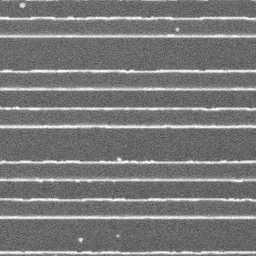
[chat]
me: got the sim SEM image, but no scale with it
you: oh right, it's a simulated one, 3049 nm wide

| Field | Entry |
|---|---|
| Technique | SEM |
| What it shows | lines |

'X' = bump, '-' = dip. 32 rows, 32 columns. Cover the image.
--------------------------------
--------------------------------
XXXXXXXXXXXXXXXXXXXXXXXXXXXXXXXX
XXXXXXXXXXXXXXXXXXXXXXXXXXXXXXXX
XXXXXXXXXXXXXXXXXXXXXXXXXXXXXXXX
--------------------------------
--------------------------------
--------------------------------
--------------------------------
XXXXXXXXXXXXXXXXXXXXXXXXXXXXXXXX
XXXXXXXXXXXXXXXXXXXXXXXXXXXXXXXX
--------------------------------
--------------------------------
--------------------------------
XXXXXXXXXXXXXXXXXXXXXXXXXXXXXXXX
XXXXXXXXXXXXXXXXXXXXXXXXXXXXXXXX
--------------------------------
--------------------------------
--------------------------------
--------------------------------
XXXXXXXXXXXXXXXXXXXXXXXXXXXXXXXX
XXXXXXXXXXXXXXXXXXXXXXXXXXXXXXXX
XX-XXXXXXXXXXXXXXXXXXXXXXXXXXXXX
--------------------------------
--------------------------------
XXXXXXXXXXXXXXXXXXXXXXXXXXXXXXXX
XXXXXXXXXXXXXXXXXXXXXXXXXXXXXXXX
--------------------------------
--------------------------------
--------------------------------
--------------------------------
--------------------------------